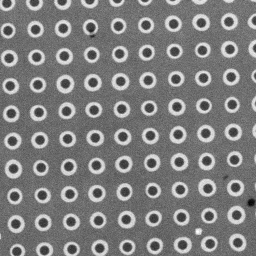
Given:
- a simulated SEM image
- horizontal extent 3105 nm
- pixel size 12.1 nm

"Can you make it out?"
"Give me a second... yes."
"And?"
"an array of small figures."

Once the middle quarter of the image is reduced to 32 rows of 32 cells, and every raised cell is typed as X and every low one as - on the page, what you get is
--------------------------------
--------------------------------
-------------XX-----XX-----XXX--
XX----XXX---XXXX---XXXX---XXXX--
XX---XXXX---XXXX---XXXX---XXXX--
XX---XXXX---XXXX----XXX----XX---
XX----XX------------------------
--------------------------------
--------------------------------
--------------X-----XXX----XXX--
XX----XXX----XXX---XXXX---XXXX--
XXX--XXXX----XXX---XXXX---XXXX--
XXX---XXX----XXX----XX-----XX---
XX------------------------------
--------------------------------
--------------------------------
--------------XX----XXX----XXX--
XX----XXXX---XXXX---XXXX---XXX--
XXX---XXXX---XXXX---XXXX---XXX--
XXX---XXXX---XXX----XXX----XXX--
XX------------------------------
--------------------------------
----------------------------XX--
--------------XXX----XXX---XXXX-
XXX---XXXX---XXXX---XXXX---XXXX-
XXX---XXXX---XXXX---XXXX---XXXX-
XXX---XXXX----XX-----XX-----XX--
XX------------------------------
--------------------------------
--------------------------------
-------XX-----XXX----XXX---XXXX-
XXX---XXXX---XXXX----XXX---XXXX-